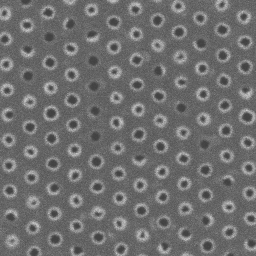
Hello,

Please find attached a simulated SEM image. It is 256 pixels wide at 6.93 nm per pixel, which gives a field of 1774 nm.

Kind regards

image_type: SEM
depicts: a regular array of holes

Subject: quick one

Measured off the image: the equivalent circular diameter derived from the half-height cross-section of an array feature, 63.1 nanometres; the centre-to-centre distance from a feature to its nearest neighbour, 171 nanometres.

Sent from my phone